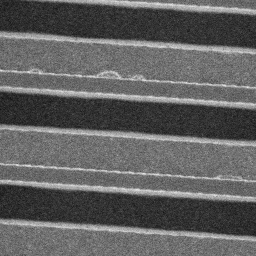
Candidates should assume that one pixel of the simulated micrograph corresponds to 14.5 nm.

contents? lines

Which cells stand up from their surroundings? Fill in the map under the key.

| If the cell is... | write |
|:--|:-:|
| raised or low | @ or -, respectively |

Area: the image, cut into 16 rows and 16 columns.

-------------@@@
----------------
@@@@------------
@@@@@@@@@@@@@@@@
@@@@@@@@@@@@@@@@
-@@@@@@@@@@@@@@@
---------------@
----------------
@@@@@@@@--------
@@@@@@@@@@@@@@@@
@@@@@@@@@@@@@@@@
---@@@@@@@@@@@@@
----------------
----------------
@@@@@@@@@-------
@@@@@@@@@@@@@@@@